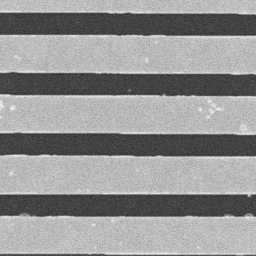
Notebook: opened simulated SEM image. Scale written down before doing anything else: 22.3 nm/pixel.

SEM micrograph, lines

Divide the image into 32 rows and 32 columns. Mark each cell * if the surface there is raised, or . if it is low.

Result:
********************************
.............*******************
................................
................................
*********************...........
********************************
********************************
********************************
********************************
................................
................................
................................
********************************
********************************
********************************
********************************
********************************
................................
................................
.***.**.........................
********************************
********************************
********************************
********************************
................................
................................
................................
********************************
********************************
********************************
********************************
********************************